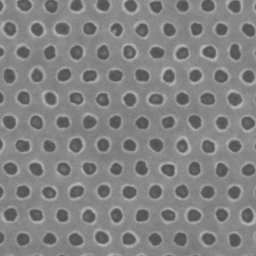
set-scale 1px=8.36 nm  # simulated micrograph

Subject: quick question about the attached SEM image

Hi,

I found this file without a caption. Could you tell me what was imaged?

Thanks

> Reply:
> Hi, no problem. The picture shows a regular array of holes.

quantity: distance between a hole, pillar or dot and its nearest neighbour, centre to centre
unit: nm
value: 215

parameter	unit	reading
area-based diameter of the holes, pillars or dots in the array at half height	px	13.6